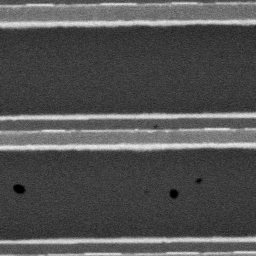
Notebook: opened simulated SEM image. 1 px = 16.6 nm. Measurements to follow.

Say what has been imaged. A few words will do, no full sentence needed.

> lines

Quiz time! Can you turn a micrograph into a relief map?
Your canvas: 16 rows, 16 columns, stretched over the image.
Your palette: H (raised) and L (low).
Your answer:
HHHHHHHHHHHHHHHH
LLLLLLLLLLLLLLLL
LLLLLLLLLLLLLLLL
LLLLLLLLLLLLLLLL
LLLLLLLLLLLLLLLL
LLLLLLLLLLLLLLLL
LLLLLLLLLLLLLLLL
HHHHHHHHHHHHHHHH
HHHHHHHHHHHHHHHH
LLLLLLLLLLLLLLLL
LLLLLLLLLLLLLLLL
LLLLLLLLLLLLLLLL
LLLLLLLLLLLLLLLL
LLLLLLLLLLLLLLLL
LLLLLLLLLLLLLLLL
HHHHHHHHHHHHHHHH